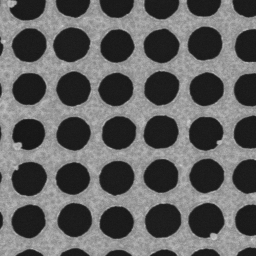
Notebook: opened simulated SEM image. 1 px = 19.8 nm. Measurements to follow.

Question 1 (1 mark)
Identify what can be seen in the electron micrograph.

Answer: a regular array of holes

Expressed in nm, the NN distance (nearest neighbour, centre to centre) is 844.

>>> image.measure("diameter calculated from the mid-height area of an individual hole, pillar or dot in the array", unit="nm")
680